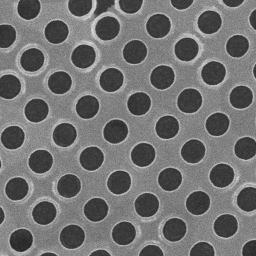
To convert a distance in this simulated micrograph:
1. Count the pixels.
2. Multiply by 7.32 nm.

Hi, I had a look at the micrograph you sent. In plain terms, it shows a regular array of holes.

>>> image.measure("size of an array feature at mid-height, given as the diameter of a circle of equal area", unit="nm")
179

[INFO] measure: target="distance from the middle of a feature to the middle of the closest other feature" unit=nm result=262